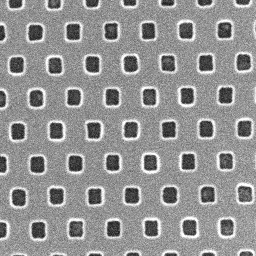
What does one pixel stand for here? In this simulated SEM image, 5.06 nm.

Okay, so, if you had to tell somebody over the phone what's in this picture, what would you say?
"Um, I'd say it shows a regular array of holes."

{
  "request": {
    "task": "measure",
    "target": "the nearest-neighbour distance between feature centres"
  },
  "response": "189 nanometers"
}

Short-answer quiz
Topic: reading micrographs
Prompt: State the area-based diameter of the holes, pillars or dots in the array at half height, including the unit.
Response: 86.9 nm